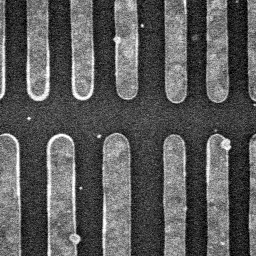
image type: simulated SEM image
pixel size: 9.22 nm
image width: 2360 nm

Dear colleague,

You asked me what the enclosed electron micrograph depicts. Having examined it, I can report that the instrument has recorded groups of lines, slits or small figures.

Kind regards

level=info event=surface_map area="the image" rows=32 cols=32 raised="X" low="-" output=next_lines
---XXX---XX---XXX----XX---XX---X
---XXX---XX---XXX----XX---XX---X
---XXX---XX---XXX----XX---XX---X
---XXX---XX---XXX----XX---XX---X
---XXX---XXX--XXX----XX---XX---X
---XXX---XXX---XX----XX---XX---X
----XX---XXX---XX----XX---XX---X
---XXX---XXX---XX----XX---XX---X
---XXX---XXX---XX----XX---XX---X
---XXX---XXX---XX----XX---XX---X
----XX---XXX---XX----XX---XX---X
----XX---XX----XX----XX---XX---X
---------------------XX---XX----
--------------------------------
--------------------------------
--------------------------------
--------------------------------
XX-----XX----XXX-----XX---XX---X
XX----XXX----XXX-----XX---XXX--X
XX----XXX----XXX-----XX---XX---X
XX----XXX----XXX-----XX---XX---X
XX----XXX----XXX-----XX---XX---X
XX----XXX----XXX-----XX---XX---X
XX----XXX----XXX-----XX---XX---X
XX----XXX----XXX-----XX---XX---X
XX----XXX----XXX-----XX---XX---X
XX----XXX----XXX-----XX---XX---X
XX----XXX----XXX-----XX---XX---X
XX----XXX----XXX-----XX---XX---X
XX----XXXX---XXX-----XX---XX---X
XX----XXXX---XXX-----XX---XX---X
XX----XXX----XXX-----XX---XXX--X